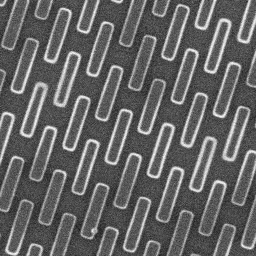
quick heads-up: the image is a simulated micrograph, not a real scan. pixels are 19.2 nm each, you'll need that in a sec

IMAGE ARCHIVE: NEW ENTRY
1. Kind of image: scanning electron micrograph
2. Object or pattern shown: groups of lines, slits or small figures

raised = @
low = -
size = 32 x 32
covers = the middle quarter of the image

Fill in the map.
-@@---@@@---------@@@--------@@@
@@@---@@@---@@----@@@--------@@@
@@@---@@---@@@---@@@---------@@@
@@---------@@@---@@@--------@@@@
@@---------@@@--@@@@--@@@---@@@-
@@--------@@@@--@@@---@@@---@@@-
@---------@@@-----@---@@@---@@@-
@---------@@@--------@@@---@@@--
@---@@---@@@@--------@@@---@@@--
---@@@---@@@---------@@@----@@--
---@@@---@@@--------@@@@--------
---@@@--@@@@--------@@@---------
--@@@---@@@---@@@---@@@--------@
--@@@---@@@---@@@--@@@@--------@
--@@@--------@@@---@@@---------@
-@@@---------@@@---@@@---@@----@
-@@@---------@@@---@@@--@@@---@@
-@@@--------@@@---------@@@---@@
@@@@--------@@@---------@@@---@@
@@@---@@----@@@---------@@----@@
@@@---@@---@@@---------@@@------
-----@@@---@@@---------@@@------
-----@@@---@@@--------@@@-------
-----@@@---@@@--@@@---@@@-------
----@@@----@@---@@@---@@@-------
----@@@--------@@@@--@@@--------
----@@@--------@@@---@@@---@@---
---@@@---------@@@---@@@---@@@--
---@@@--------@@@@--------@@@---
---@@@--------@@@---------@@@---
--@@@---@@@---@@@---------@@@---
--@@@---@@@---@@@--------@@@----